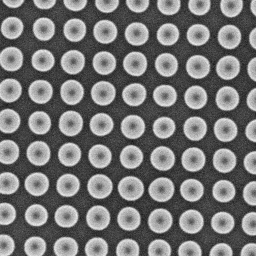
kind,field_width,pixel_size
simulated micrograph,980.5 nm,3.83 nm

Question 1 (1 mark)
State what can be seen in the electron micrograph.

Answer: an array of small figures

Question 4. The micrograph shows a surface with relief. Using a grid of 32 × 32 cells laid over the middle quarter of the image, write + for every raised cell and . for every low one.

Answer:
+++++..++++++..++++++..+++++...+
++++....++++...+++++...+++++...+
.........++......+++....+++....+
................................
+++......++.....................
++++...+++++....++++....++......
+++++..++++++..+++++...+++++...+
+++++..++++++..+++++..++++++..++
++++...+++++...+++++...+++++..++
++++....++++...+++++...+++++..++
...............................+
................................
++++.....+......................
++++...+++++....+++.....++......
+++++..+++++..++++++...++++....+
+++++..+++++..++++++..++++++..++
++++...+++++..++++++..++++++..++
+++.....+++....++++....++++...++
.................+.............+
................................
+++.....++......+...............
++++...++++....++++....+++.....+
++++..++++++..++++++..+++++...++
++++..++++++..++++++..++++++..++
+++....++++...+++++...+++++...++
........+++....+++.....++++...++
.........................+.....+
................................
+++....++++....+++..............
++++..++++++..+++++...+++++...++
++++..++++++..++++++.++++++..+++
+++...++++++..++++++.++++++..+++